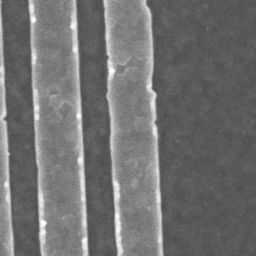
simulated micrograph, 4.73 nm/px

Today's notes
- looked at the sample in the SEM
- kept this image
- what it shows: one or a few lines or trenches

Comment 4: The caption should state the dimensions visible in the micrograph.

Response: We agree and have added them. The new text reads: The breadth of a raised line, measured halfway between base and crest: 0.221 um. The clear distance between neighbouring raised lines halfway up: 135 nanometers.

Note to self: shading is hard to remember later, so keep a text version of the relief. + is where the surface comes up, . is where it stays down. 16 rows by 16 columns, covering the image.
..+++..++.......
..+++..++.......
..+++..++.......
..+++..+++......
..+++..+++......
..+++..+++......
..+++..+++......
..+++..+++......
..+++..+++......
+.+++..+++......
+.+++..+++......
+.+++..+++......
+.+++..+++......
+.+++..+++......
+..++..+++......
+..++..+++......